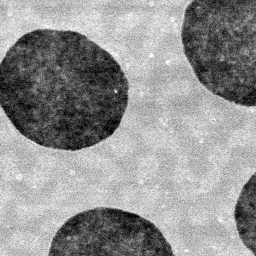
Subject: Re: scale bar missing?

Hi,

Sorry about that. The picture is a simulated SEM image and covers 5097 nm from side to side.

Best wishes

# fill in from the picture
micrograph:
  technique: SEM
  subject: holes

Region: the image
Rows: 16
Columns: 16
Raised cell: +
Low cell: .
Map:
++++++++++++....
+++++++++++.....
+.....+++++.....
.......+++++....
........++++....
........+++++...
........+++++++.
+.......++++++++
+......+++++++++
++++++++++++++++
++++++++++++++++
+++++++++++++++.
+++++++++++++++.
+++++....++++++.
++++......+++++.
+++........++++.